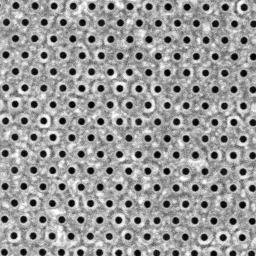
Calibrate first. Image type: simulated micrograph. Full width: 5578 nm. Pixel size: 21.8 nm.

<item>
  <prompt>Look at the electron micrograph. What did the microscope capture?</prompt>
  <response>a regular array of holes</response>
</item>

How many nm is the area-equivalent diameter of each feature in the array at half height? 170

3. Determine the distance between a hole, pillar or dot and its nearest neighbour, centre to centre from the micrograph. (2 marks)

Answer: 404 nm